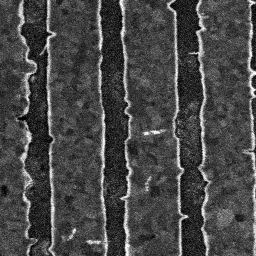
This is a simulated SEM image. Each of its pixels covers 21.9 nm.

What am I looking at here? one or a few lines or trenches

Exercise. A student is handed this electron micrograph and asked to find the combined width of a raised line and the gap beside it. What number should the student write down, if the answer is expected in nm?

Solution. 1660